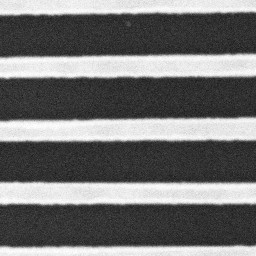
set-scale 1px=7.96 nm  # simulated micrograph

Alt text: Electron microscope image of lines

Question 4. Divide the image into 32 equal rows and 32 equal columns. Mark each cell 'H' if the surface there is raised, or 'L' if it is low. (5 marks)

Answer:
HHHHHHHHHHHHHHHHHHHHHHHHHHHHHHHH
HHHHHHHHHHHHHHHHHHHLLHHLLLLLLLLL
LLLLLLLLLLLLLLLLLLLLLLLLLLLLLLLL
LLLLLLLLLLLLLLLLLLLLLLLLLLLLLLLL
LLLLLLLLLLLLLLLLLLLLLLLLLLLLLLLL
LLLLLLLLLLLLLLLLLLLLLLLLLLLLLLLL
LLLLLLLLLLLLLLLLLLLLLLLLLLLLLLLL
HHHHHHHHHHHHHHHHHHHHHHHHHHHHHHHH
HHHHHHHHHHHHHHHHHHHHHHHHHHHHHHHH
HHHHHHHHHHHHHHHHHHHHHHHHLHHHLLLL
LLLLLLLLLLLLLLLLLLLLLLLLLLLLLLLL
LLLLLLLLLLLLLLLLLLLLLLLLLLLLLLLL
LLLLLLLLLLLLLLLLLLLLLLLLLLLLLLLL
LLLLLLLLLLLLLLLLLLLLLLLLLLLLLLLL
LLLLLLLLLLLLLLLLLLLLLLLLLLLLLLLL
HHHHHHHHHHHHHHHHHHHHHHHHHHHHHHHH
HHHHHHHHHHHHHHHHHHHHHHHHHHHHHHHH
HHHLHLLHHLLLLLLLLLLLLLLLLLLLLLLL
LLLLLLLLLLLLLLLLLLLLLLLLLLLLLLLL
LLLLLLLLLLLLLLLLLLLLLLLLLLLLLLLL
LLLLLLLLLLLLLLLLLLLLLLLLLLLLLLLL
LLLLLLLLLLLLLLLLLLLLLLLLLLLLLLLL
LLLLLLLLLLLLLLLLLLLLLLLLLLLLLLLL
HHHHHHHHHHHHHHHHHHHHHHHHHHHHHHHH
HHHHHHHHHHHHHHHHHHHHHHHHHHHHHHHH
LLLLLLLLLLLLLLLLLLLLLLLLLLLLLLLL
LLLLLLLLLLLLLLLLLLLLLLLLLLLLLLLL
LLLLLLLLLLLLLLLLLLLLLLLLLLLLLLLL
LLLLLLLLLLLLLLLLLLLLLLLLLLLLLLLL
LLLLLLLLLLLLLLLLLLLLLLLLLLLLLLLL
LLLLLLLLLLLLLLLLLLLLLLLLLLLLLLLL
HHHHHHHHHHHHHHHHHHHHHHHHHHHHHHHH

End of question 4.